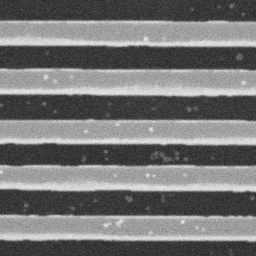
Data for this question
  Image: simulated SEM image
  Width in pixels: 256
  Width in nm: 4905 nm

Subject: lines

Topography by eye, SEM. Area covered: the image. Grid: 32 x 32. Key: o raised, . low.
................................
................................
................................
oooooooooooooooooooooooooooooooo
oooooooooooooooooooooooooooooooo
..........oooooooooooooooooooooo
................................
................................
................................
oooooooooooooooooooooooooooooooo
oooooooooooooooooooooooooooooooo
ooooooooooo.oooo....oooooooooooo
................................
................................
................................
oooooooooooooooooooooooooooooooo
oooooooooooooooooooooooooooooooo
oooooooooooooooooooooooooooooooo
................................
................................
................................
oooooooooooooooooooooooooooooooo
oooooooooooooooooooooooooooooooo
......ooo.....oooooooooooooooooo
................................
................................
................................
oooooooooooooooooooooooooooooooo
oooooooooooooooooooooooooooooooo
oooooooooooooooooooooooooooooooo
................................
................................